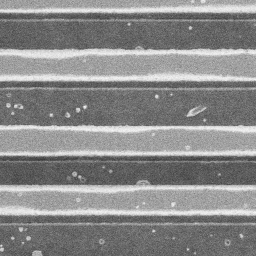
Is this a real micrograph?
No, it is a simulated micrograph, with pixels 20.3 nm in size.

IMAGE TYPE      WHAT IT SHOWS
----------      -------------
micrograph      lines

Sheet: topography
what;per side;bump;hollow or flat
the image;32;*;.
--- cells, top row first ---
********************************
................................
................................
................................
................................
................................
****....************************
********************************
********************************
********************************
................................
................................
................................
................................
................................
................................
********************************
********************************
********************************
................................
................................
................................
................................
********************************
********************************
********************************
********************************
................................
................................
................................
................................
....*...........................